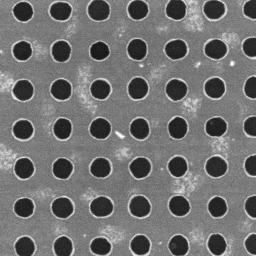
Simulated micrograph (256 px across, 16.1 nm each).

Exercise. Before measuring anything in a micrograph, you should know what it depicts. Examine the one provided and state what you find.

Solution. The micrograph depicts a regular array of holes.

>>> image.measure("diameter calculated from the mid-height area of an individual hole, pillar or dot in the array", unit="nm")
335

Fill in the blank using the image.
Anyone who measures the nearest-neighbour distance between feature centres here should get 38.1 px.